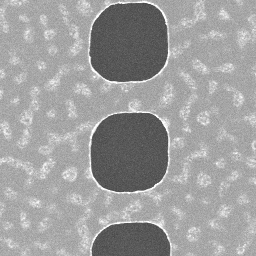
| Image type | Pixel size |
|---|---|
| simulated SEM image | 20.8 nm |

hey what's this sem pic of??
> holes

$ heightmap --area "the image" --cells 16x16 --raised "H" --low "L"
HHHHHHHLLLHHHHHH
HHHHHHLLLLHHHHHH
HHHHHHLLLLHHHHHH
HHHHHHLLLLHHHHHH
HHHHHHLLLLHHHHHH
HHHHHHHHHHHHHHHH
HHHHHHHHHHHHHHHH
HHHHHHLLLLHHHHHH
HHHHHHLLLLLHHHHH
HHHHHHLLLLLHHHHH
HHHHHHLLLLHHHHHH
HHHHHHLLLLHHHHHH
HHHHHHHHHHHHHHHH
HHHHHHHHHHHHHHHH
HHHHHHLLLLHHHHHH
HHHHHHLLLLLHHHHH